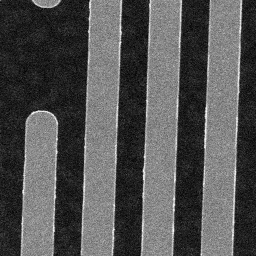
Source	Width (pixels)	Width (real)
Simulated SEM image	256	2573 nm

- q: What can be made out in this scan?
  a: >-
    parallel lines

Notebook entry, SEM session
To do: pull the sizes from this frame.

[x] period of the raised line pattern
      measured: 0.601 micrometres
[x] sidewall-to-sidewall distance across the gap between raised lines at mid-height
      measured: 0.287 micrometres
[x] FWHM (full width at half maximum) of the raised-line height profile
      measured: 0.316 um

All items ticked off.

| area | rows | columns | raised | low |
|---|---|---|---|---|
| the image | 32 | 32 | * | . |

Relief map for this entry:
.....**....****....****...****..
...........****....****...****..
...........****....****...****..
...........****....****...****..
...........****....***....****..
...........****....****...****..
...........****....***....****..
...........****....***....****..
...........****...****....****..
...........****...****....****..
...........****...****....****..
...........****...****....****..
...........****...****....****..
...........****...****....****..
....***....****...****....****..
...****....****...****....****..
...****....****...****....****..
...****....****...****....****..
...****....***....****....***...
...****....****...****....***...
...****....***....****....***...
...****....***....****....***...
...****....***....****...****...
...****...****....****...****...
...****....***....****...****...
...****...****....****...****...
...****...****....****...****...
...****...****....****...****...
...****...****....****...****...
...****...****....****...****...
...****...****....****...****...
...****...****....****...****...